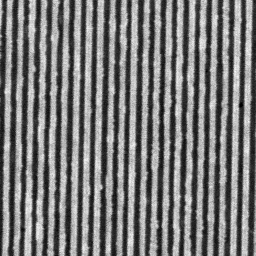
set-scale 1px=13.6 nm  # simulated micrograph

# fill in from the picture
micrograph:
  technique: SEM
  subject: parallel lines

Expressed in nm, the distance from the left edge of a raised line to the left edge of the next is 155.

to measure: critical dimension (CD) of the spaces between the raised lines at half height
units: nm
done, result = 89.8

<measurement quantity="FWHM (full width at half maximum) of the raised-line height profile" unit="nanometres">64.4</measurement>